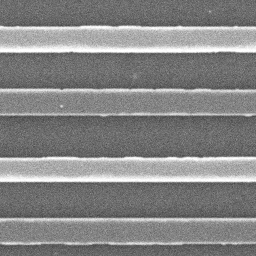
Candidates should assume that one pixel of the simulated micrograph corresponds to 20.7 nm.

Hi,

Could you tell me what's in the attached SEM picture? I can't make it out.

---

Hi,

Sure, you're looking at lines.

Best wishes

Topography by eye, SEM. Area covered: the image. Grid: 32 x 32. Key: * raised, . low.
................................
................................
................................
********************************
********************************
********************************
................................
................................
................................
................................
................................
********************************
********************************
********************************
................................
................................
................................
................................
................................
................................
********************************
********************************
************.*******************
................................
................................
................................
................................
********************************
********************************
********************************
................................
................................